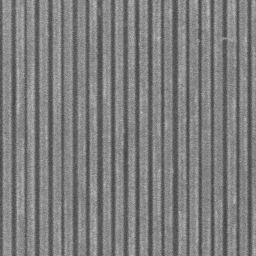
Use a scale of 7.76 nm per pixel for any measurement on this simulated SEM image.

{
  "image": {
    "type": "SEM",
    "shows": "parallel lines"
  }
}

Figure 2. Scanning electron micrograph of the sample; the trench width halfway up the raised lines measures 43.6 nm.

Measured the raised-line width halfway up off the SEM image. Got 0.0514 microns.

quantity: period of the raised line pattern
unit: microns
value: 0.0966